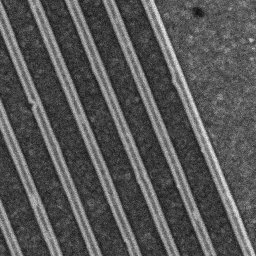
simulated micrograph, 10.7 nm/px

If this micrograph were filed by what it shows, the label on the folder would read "parallel lines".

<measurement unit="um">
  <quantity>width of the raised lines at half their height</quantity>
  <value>0.0939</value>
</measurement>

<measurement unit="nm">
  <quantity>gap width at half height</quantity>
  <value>290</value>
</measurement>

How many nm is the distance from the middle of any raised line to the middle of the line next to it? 379